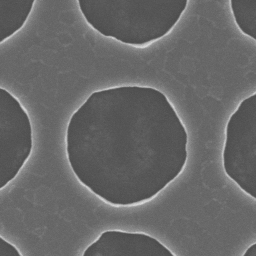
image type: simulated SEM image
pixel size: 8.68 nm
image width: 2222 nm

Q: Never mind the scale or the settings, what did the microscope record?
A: holes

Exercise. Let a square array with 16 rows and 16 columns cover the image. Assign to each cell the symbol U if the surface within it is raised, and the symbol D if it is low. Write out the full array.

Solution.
DDUUUDDDDDDDUUDD
DUUUUUDDDDDUUUUD
UUUUUUUDDDUUUUUU
UUUUUUUUUUUUUUUU
UUUUUUUUUUUUUUUU
UUUUUUUDDUUUUUUU
DUUUUDDDDDDUUUUD
DDUUDDDDDDDUUUDD
DDUUDDDDDDDDUUDD
DDUUDDDDDDDDUUDD
DUUUUDDDDDDUUUDD
UUUUUDDDDDUUUUUD
UUUUUUUDDUUUUUUU
UUUUUUUUUUUUUUUU
UUUUUUUDUUUUUUUU
DUUUUUDDDDUUUUUU